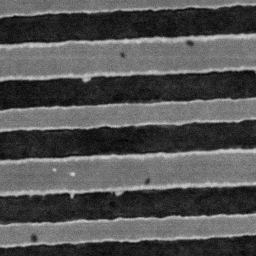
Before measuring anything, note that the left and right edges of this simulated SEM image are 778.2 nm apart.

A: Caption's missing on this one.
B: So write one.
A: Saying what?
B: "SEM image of lines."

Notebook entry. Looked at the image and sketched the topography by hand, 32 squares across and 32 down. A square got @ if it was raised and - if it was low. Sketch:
@@@@@@@@@@@@@@@@@@@@@@@@@@@@@@@@
@@@@@@@@@@@@@-------------------
--------------------------------
--------------------------------
---------------------------@@@@@
--@@@@@@@@@@@@@@@@@@@@@@@@@@@@@@
@@@@@@@@@@@@@@@@@@@@@@@@@@@@@@@@
@@@@@@@@@@@@@@@@@@@@@@@@@@@@@@@@
@@@@@@@@@@@@@@@@@@@@@@@@@@@@@@@@
@@@@@@@@@@@@--------------------
--------------------------------
--------------------------------
---------------------------@@@@@
-----@@@@@@@@@@@@@@@@@@@@@@@@@@@
@@@@@@@@@@@@@@@@@@@@@@@@@@@@@@@@
@@@@@@@@@@@@@@@@@@@@@@@---------
--------------------------------
--------------------------------
--------------------------------
-----------@@@@@@@@@@@@@@@@@@@@@
@@@@@@@@@@@@@@@@@@@@@@@@@@@@@@@@
@@@@@@@@@@@@@@@@@@@@@@@@@@@@@@@@
@@@@@@@@@@@@@@@@@@@@@@@@@@@@@@@@
@@@@@@@@@@@@@@@@@@@@@@----------
--------------------------------
--------------------------------
--------------------------------
----------@-@@@@@@@@@@@@@@@@@@@@
@@@@@@@@@@@@@@@@@@@@@@@@@@@@@@@@
@@@@@@@@@@@@@@@@@@@@@@@@@@@@@---
@@@@@@@-------------------------
--------------------------------